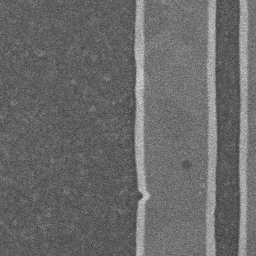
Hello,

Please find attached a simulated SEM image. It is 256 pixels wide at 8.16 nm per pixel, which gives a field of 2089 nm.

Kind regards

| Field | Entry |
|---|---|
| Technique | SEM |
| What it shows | one or a few lines or trenches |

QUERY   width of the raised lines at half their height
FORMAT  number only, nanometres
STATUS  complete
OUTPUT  590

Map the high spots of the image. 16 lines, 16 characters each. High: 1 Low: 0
0000000001111001
0000000001111001
0000000001111001
0000000001111001
0000000001111001
0000000001111001
0000000001111001
0000000001111001
0000000001111001
0000000001111001
0000000001111001
0000000001111001
0000000001111001
0000000001111001
0000000001111001
0000000001111001